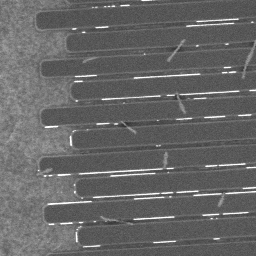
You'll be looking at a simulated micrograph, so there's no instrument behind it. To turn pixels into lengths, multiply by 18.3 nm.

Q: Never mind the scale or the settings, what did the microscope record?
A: parallel lines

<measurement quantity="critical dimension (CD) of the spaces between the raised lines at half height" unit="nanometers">88.9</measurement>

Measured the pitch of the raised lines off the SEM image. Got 442 nm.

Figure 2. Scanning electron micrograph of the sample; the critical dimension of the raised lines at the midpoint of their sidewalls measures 356 nm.